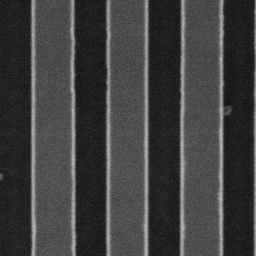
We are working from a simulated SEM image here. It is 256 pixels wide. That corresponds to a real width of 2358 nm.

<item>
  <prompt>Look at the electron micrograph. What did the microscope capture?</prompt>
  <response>lines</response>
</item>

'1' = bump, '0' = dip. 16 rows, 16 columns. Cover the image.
0011100110011100
0011100110011100
0011100110011100
0011100110011100
0011100110011100
0011100110011100
0011100110011100
0011100110011100
0011100110011100
0011100110011100
0011100110011100
0011100110011100
0011100110011100
0011100110011100
0011100110011100
0011100110011100